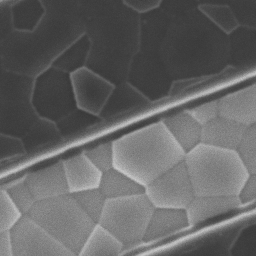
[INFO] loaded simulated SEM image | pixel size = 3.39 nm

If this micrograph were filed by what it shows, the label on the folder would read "one or a few lines or trenches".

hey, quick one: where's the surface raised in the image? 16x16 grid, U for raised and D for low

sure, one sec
UUUUUUUUUUUUUUUU
UUUUUUUUUUUUUUUU
UUUUUUUUUUUUUUUU
UUUUUUUUUUUUUUUU
UUUUUUUUUUUUUUUU
UUUUUUUUUUUUUUDD
UUUUUUUUUUUDDDDD
UUUUUUUUUDDDDDDD
UUUUUUDDDDDDDDDD
UUUUDDDDDDDDDDDD
UDDDDDDDDDDDDDDD
DDDDDDDDDDDDDDDD
DDDDDDDDDDDDDDDD
DDDDDDDDDDDDDDDU
DDDDDDDDDDDDUUUU
DDDDDDDDDDUUUUUU